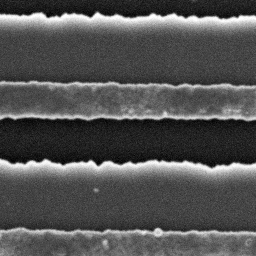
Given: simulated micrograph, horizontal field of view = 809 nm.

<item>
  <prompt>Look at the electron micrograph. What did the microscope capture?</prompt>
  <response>lines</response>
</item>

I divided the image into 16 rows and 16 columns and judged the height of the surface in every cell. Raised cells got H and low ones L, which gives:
LLLLLLLLLLLLLLLL
HHHHHHHHHHHHHHHH
HHHHHHHHHHHHHHHH
HHHHHHHHHHHHHHHH
HHHHHHHHHHHHHHHH
HHHHHHHHHHHHHHHH
HHHHHHHHHHHHHHHH
LLLLLLLLLLLLLLLL
LLLLLLLLLLLLLLLL
LLLLLLLLLLLLLLLL
HHHHHHHHHHHHHHHH
HHHHHHHHHHHHHHHH
HHHHHHHHHHHHHHHH
HHHHHHHHHHHHHHHH
HHHHHHHHHHHHHHHH
HHHHHHHHHHHHHHHH